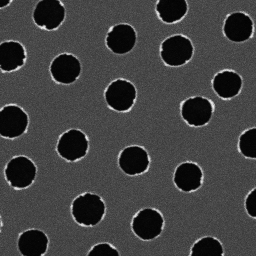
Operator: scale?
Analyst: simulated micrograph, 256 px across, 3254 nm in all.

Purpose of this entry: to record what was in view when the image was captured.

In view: a regular array of holes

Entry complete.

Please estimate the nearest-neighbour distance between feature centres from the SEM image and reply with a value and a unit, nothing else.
719 nm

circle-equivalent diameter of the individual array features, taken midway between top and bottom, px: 29.7